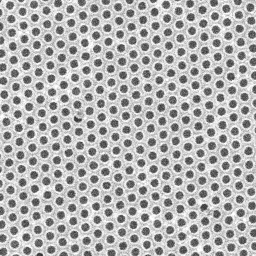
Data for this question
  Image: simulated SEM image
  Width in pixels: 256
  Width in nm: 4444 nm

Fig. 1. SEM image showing a regular array of holes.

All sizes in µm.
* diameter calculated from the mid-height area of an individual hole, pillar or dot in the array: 0.159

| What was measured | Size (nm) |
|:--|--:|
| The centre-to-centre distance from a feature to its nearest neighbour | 233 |